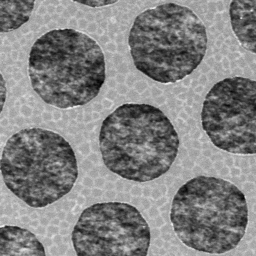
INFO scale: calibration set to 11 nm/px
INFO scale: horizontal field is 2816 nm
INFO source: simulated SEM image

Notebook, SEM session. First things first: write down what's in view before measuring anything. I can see holes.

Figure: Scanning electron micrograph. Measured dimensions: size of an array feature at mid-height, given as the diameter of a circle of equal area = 875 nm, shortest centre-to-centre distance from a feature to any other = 1130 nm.